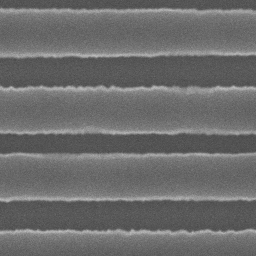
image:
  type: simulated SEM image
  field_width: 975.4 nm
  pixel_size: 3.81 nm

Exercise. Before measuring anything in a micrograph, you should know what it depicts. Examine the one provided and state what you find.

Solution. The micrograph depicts lines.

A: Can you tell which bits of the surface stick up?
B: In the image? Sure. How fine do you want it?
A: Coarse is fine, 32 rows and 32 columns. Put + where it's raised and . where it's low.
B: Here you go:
................................
++++++++++++++++++++++++++++++++
++++++++++++++++++++++++++++++++
++++++++++++++++++++++++++++++++
++++++++++++++++++++++++++++++++
++++++++++++++++++++++++++++++++
++++++++++++++++++++++++++++++++
................................
................................
................................
................................
++++++++++++++++++++++++++++++++
++++++++++++++++++++++++++++++++
++++++++++++++++++++++++++++++++
++++++++++++++++++++++++++++++++
++++++++++++++++++++++++++++++++
++++++++++...+++++++++++++++++++
................................
................................
++++++++++++++++++++++++++++++++
++++++++++++++++++++++++++++++++
++++++++++++++++++++++++++++++++
++++++++++++++++++++++++++++++++
++++++++++++++++++++++++++++++++
++++++++++++++++++++++++++++++++
................................
................................
................................
................................
++++++++++++++++++++++++++++++++
++++++++++++++++++++++++++++++++
++++++++++++++++++++++++++++++++